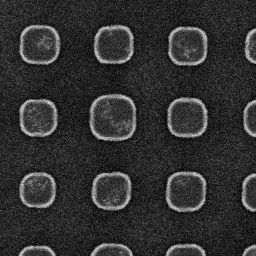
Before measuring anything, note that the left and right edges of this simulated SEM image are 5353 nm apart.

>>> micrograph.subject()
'a regular array of raised bodies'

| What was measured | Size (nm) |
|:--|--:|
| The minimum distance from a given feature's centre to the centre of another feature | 1520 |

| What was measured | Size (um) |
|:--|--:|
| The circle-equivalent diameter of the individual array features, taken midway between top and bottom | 0.811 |